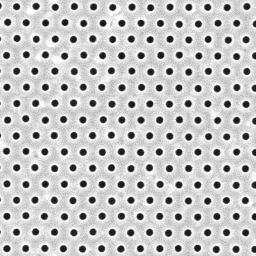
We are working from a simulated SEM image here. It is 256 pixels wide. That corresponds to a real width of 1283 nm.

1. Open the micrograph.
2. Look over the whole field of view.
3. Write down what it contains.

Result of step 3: a regular array of holes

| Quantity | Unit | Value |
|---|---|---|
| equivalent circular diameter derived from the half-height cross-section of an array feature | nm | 35.7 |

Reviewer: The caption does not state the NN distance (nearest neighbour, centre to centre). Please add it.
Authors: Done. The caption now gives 91.1 nanometers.